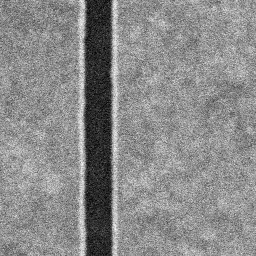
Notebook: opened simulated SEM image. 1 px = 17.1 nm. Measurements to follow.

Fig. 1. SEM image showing one or a few lines or trenches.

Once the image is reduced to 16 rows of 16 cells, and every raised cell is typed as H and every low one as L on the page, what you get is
HHHHHLLHHHHHHHHH
HHHHHLLHHHHHHHHH
HHHHHLLHHHHHHHHH
HHHHHLLHHHHHHHHH
HHHHHLLHHHHHHHHH
HHHHHLLHHHHHHHHH
HHHHHLLHHHHHHHHH
HHHHHLLHHHHHHHHH
HHHHHLLHHHHHHHHH
HHHHHLLHHHHHHHHH
HHHHHLLHHHHHHHHH
HHHHHLLHHHHHHHHH
HHHHHLLHHHHHHHHH
HHHHHLLHHHHHHHHH
HHHHHLLHHHHHHHHH
HHHHHLLHHHHHHHHH